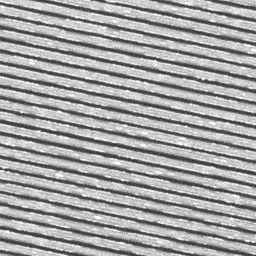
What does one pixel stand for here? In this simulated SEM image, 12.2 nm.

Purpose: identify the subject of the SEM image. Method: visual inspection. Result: parallel lines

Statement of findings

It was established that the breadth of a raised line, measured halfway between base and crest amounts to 0.0761 microns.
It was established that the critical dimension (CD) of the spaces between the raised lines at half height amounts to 64.2 nm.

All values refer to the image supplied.